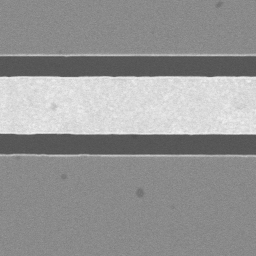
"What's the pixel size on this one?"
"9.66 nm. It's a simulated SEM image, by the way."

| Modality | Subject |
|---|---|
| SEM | lines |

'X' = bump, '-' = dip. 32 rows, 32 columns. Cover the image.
XXXXXXXXXXXXXXXXXXXXXXXXXXXXXXXX
XXXXXXXXXXXXXXXXXXXXXXXXXXXXXXXX
XXXXXXXXXXXXXXXXXXXXXXXXXXXXXXXX
XXXXXXXXXXXXXXXXXXXXXXXXXXXXXXXX
XXXXXXXXXXXXXXXXXXXXXXXXXXXXXXXX
XXXXXXXXXXXXXXXXXXXXXXXXXXXXXXXX
XXXXXXXXXXXXXXXXXXXXXXXXXXXXXXXX
--------------------------------
--------------------------------
--------------------------------
XXXXXXXXXXXXXXXXXXXXXXXXXXXXXXXX
XXXXXXXXXXXXXXXXXXXXXXXXXXXXXXXX
XXXXXXXXXXXXXXXXXXXXXXXXXXXXXXXX
XXXXXXXXXXXXXXXXXXXXXXXXXXXXXXXX
XXXXXXXXXXXXXXXXXXXXXXXXXXXXXXXX
XXXXXXXXXXXXXXXXXXXXXXXXXXXXXXXX
XXXXXXXXXXXXXXXXXXXXXXXXXXXXXXXX
--------------------------------
--------------------------------
XXXXXXXXXXXXXXXXXXXXXXXXXXXXXXXX
XXXXXXXXXXXXXXXXXXXXXXXXXXXXXXXX
XXXXXXXXXXXXXXXXXXXXXXXXXXXXXXXX
XXXXXXXXXXXXXXXXXXXXXXXXXXXXXXXX
XXXXXXXXXXXXXXXXXXXXXXXXXXXXXXXX
XXXXXXXXXXXXXXXXXXXXXXXXXXXXXXXX
XXXXXXXXXXXXXXXXXXXXXXXXXXXXXXXX
XXXXXXXXXXXXXXXXXXXXXXXXXXXXXXXX
XXXXXXXXXXXXXXXXXXXXXXXXXXXXXXXX
XXXXXXXXXXXXXXXXXXXXXXXXXXXXXXXX
XXXXXXXXXXXXXXXXXXXXXXXXXXXXXXXX
XXXXXXXXXXXXXXXXXXXXXXXXXXXXXXXX
XXXXXXXXXXXXXXXXXXXXXXXXXXXXXXXX